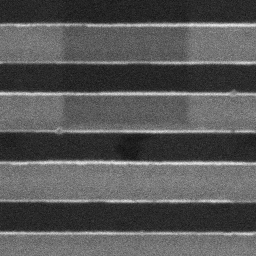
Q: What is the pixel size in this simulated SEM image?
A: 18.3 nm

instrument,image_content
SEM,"lines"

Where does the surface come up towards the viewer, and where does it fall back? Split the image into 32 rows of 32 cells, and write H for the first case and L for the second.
HHHHHHHHHHHHHHHHHHHHHHHHHHHHHHHH
HHHHHHHHHHHHHHHHHHHHHHHHHHHHHHHH
HHHHHHHHHHHHHHHHHHHHHHHHHHHHHHHH
LLLLLLLLLLLLLLLLLLLLLLLLLLLLLLLL
LLLLLLLLLLLLLLLLLLLLLLLLLLLLLLLL
LLLLLLLLLLLLLLLLLLLLLLLLLLLLLLLL
LLLLLLLLLLLLLLLLLLLLLLLLLLLLLLLL
LLLLLLLLLLLLLLLLLLLLLLLLLLLLLLLL
HHHHHHHHHHHHHHHHHHHHHHHHHHHHHHHH
HHHHHHHHHHHHHHHHHHHHHHHHHHHHHHHH
HHHHHHHHHHHHHHHHHHHHHHHHHHHHHHHH
HHHHHHHHHHHHHHHHHHHHHHHHHHHHHHHH
LLLLLLLLLLLLLLLLLLLLLLLLLLLLLLLL
LLLLLLLLLLLLLLLLLLLLLLLLLLLLLLLL
LLLLLLLLLLLLLLLLLLLLLLLLLLLLLLLL
LLLLLLLLLLLLLLLLLLLLLLLLLLLLLLLL
HHHHHHHHHHHHHHHHHHHLHLHHHHHHHLHH
HHHHHHHHHHHHHHHHHHHHHHHHHHHHHHHH
HHHHHHHHHHHHHHHHHHHHHHHHHHHHHHHH
HHHHHHHHHHHHHHHHHHHHHHHHHHHHHHHH
LLLLLLLLLLLLLLLLLLLLLLLLLLLLLLLL
LLLLLLLLLLLLLLLLLLLLLLLLLLLLLLLL
LLLLLLLLLLLLLLLLLLLLLLLLLLLLLLLL
LLLLLLLLLLLLLLLLLLLLLLLLLLLLLLLL
LLLLLLLLLLLLLLLLLLLLLLLLLLLLLLLL
HHHHHHHHHHHHHHHHHHHHHHHHHHHHHHHH
HHHHHHHHHHHHHHHHHHHHHHHHHHHHHHHH
HHHHHHHHHHHHHHHHHHHHHHHHHHHHHHHH
HHHHHHHHHHHHHHHHHHHHHHHHHHHHHHHH
LLLLLLLLLLLLLLLLLLLLLLLLLLLLLLLL
LLLLLLLLLLLLLLLLLLLLLLLLLLLLLLLL
LLLLLLLLLLLLLLLLLLLLLLLLLLLLLLLL